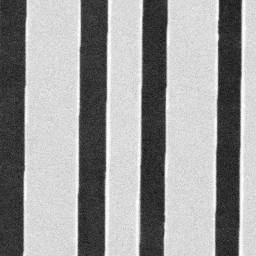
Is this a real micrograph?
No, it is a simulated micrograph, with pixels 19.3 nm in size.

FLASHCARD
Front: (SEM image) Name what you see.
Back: lines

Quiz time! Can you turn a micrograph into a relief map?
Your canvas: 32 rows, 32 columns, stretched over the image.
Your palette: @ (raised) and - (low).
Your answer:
---@@@@@@@----@@@@---@@@@@@---@@
---@@@@@@@----@@@@---@@@@@@---@@
---@@@@@@@----@@@@---@@@@@@---@@
---@@@@@@@----@@@@---@@@@@@---@@
---@@@@@@@----@@@@---@@@@@@---@@
---@@@@@@@---@@@@@---@@@@@@---@@
---@@@@@@@---@@@@@---@@@@@@---@@
---@@@@@@@---@@@@@---@@@@@@---@@
---@@@@@@@---@@@@@---@@@@@@---@@
---@@@@@@@---@@@@@---@@@@@@---@@
---@@@@@@@---@@@@@---@@@@@@---@@
---@@@@@@@---@@@@@---@@@@@@---@@
---@@@@@@@---@@@@@---@@@@@@---@@
---@@@@@@@---@@@@@---@@@@@@---@@
---@@@@@@@---@@@@@---@@@@@@---@@
---@@@@@@@---@@@@@---@@@@@@---@@
---@@@@@@@---@@@@@---@@@@@@---@@
---@@@@@@@---@@@@----@@@@@@---@@
---@@@@@@@---@@@@----@@@@@@---@@
---@@@@@@@---@@@@----@@@@@@---@@
---@@@@@@@---@@@@----@@@@@@---@@
---@@@@@@@---@@@@----@@@@@@---@@
---@@@@@@@---@@@@----@@@@@@---@@
---@@@@@@@---@@@@----@@@@@@---@@
---@@@@@@@---@@@@----@@@@@@---@@
---@@@@@@@---@@@@----@@@@@@---@@
---@@@@@@@---@@@@----@@@@@@---@@
---@@@@@@@---@@@@----@@@@@@---@@
---@@@@@@@---@@@@----@@@@@@---@@
---@@@@@@@---@@@@----@@@@@@---@@
---@@@@@@@---@@@@----@@@@@@---@@
---@@@@@@@---@@@@----@@@@@@---@@